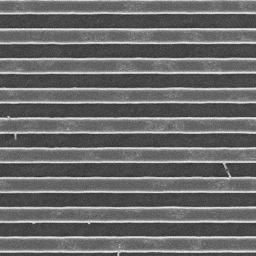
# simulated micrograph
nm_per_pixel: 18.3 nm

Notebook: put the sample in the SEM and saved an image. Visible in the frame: parallel lines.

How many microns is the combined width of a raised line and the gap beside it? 0.543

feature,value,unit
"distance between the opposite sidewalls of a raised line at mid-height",265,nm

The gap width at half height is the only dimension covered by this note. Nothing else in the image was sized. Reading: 281 nm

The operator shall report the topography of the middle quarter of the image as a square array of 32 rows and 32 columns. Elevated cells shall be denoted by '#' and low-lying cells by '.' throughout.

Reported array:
################################
################################
................................
................................
................................
................................
################################
################################
################################
###################.............
................................
................................
................................
................................
################################
################################
################################
................................
................................
................................
................................
################################
################################
################################
................................
................................
................................
................................
#...................##..........
################################
################################
################################